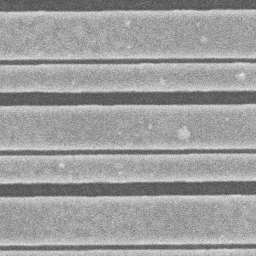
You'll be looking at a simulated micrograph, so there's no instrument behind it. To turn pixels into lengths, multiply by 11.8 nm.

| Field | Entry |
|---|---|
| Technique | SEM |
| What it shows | lines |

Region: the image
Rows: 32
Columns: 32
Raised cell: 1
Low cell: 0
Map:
00000000000000000000000000000000
00001100000011111111111111111111
11111111111111111111111111111111
11111111111111111111111111111111
11111111111111111111111111111111
11111111111111111111111111111111
11111111111111111111111111111111
11111111111111111111111111111111
11111111111111111111111111111111
11111111111111111111111111111111
11111111111111111111111111111111
00000000000000000000000000000000
00000000000000000000000000000000
11111111111111111111111111111111
11111111111111111111111111111111
11111111111111111111111111111111
11111111111111111111111111111111
11111111111111111111111111111111
11111111111111111111111111111111
11111111111111111111111111111111
11111111111111111111111111111111
11111111111111111111111111111111
11111111111111111111111111111111
00000000000000000000000000000000
00000000000000000000000000001110
11111111111111111111111111111111
11111111111111111111111111111111
11111111111111111111111111111111
11111111111111111111111111111111
11111111111111111111111111111111
11111111111111111111111111111111
11111111111111111111111111111111